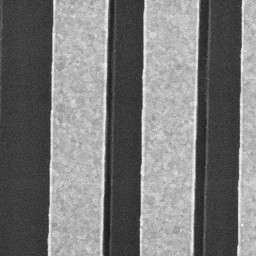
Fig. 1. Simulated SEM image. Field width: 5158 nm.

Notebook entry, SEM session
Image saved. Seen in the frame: lines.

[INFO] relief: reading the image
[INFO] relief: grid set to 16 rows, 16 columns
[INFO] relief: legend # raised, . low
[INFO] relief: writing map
...####..###...#
...####..###...#
...####..###...#
...####..###...#
...####..###...#
...####..###...#
...####..###...#
...####..###...#
...####..###...#
...####..###...#
...###...###...#
...###...###...#
...###...###...#
...###...###...#
...###...###...#
...###...###...#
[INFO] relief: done